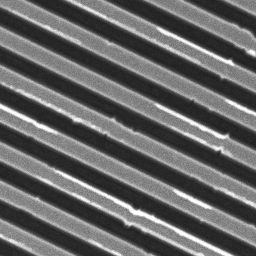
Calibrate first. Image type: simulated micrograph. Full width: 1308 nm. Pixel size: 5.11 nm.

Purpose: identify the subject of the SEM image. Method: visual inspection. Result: parallel lines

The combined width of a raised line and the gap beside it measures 176 nm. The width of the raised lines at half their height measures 94.7 nm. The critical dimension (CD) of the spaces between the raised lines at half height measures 15.8 px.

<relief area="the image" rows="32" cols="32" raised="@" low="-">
@@@@-----@@@@@-----@@@@@-----@@@
-@@@@@-----@@@@@-----@@@@@-----@
---@@@@@-----@@@@@-----@@@@@----
@----@@@@@-----@@@@@-----@@@@@--
@@@----@@@@@-----@@@@@-----@@@@@
@@@@@----@@@@@@----@@@@@-----@@@
--@@@@@----@@@@@@----@@@@@-----@
----@@@@@----@@@@@@----@@@@@@---
@-----@@@@@-----@@@@@----@@@@@@-
@@@-----@@@@@-----@@@@@----@@@@@
@@@@@-----@@@@@-----@@@@@----@@@
--@@@@@-----@@@@@-----@@@@@----@
----@@@@@-----@@@@@-----@@@@@---
@-----@@@@@-----@@@@@-----@@@@@-
@@@@----@@@@@-----@@@@@-----@@@@
@@@@@@----@@@@@-----@@@@@-----@@
--@@@@@@----@@@@@-----@@@@@-----
-----@@@@@----@@@@@@----@@@@@---
@@-----@@@@@----@@@@@@----@@@@@-
@@@@-----@@@@@----@@@@@@----@@@@
-@@@@@-----@@@@@----@@@@@@----@@
---@@@@@-----@@@@@-----@@@@@----
-----@@@@@-----@@@@@-----@@@@@--
@@-----@@@@@-----@@@@@-----@@@@@
@@@@-----@@@@@-----@@@@@-----@@@
-@@@@@-----@@@@@-----@@@@@-----@
---@@@@@-----@@@@@-----@@@@@----
-----@@@@@-----@@@@@-----@@@@@--
@@@----@@@@@-----@@@@@-----@@@@@
@@@@@----@@@@@-----@@@@@-----@@@
-@@@@@@----@@@@@-----@@@@@-----@
----@@@@@----@@@@@-----@@@@@----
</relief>